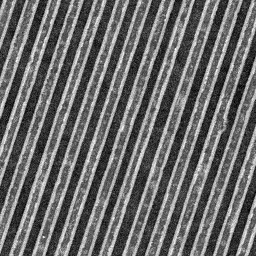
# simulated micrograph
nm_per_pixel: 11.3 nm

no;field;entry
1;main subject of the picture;parallel lines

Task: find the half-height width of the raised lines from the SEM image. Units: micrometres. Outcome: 0.112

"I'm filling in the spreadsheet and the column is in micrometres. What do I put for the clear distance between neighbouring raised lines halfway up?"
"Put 0.132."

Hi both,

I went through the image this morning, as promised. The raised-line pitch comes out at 0.243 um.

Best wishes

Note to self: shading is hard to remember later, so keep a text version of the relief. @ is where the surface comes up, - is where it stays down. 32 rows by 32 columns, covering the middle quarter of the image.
--@@@---@@----@@---@@@---@@----@
--@@----@@---@@@---@@---@@----@@
--@@---@@@---@@----@@---@@----@@
-@@@---@@----@@---@@@---@@----@@
-@@----@@---@@@---@@@--@@@---@@@
-@@---@@@---@@@---@@---@@----@@@
@@@---@@----@@---@@@---@@----@@-
@@----@@---@@@---@@@--@@----@@@-
@@---@@@---@@@---@@---@@----@@@-
@@---@@@---@@---@@@---@@----@@--
@@---@@---@@@---@@@--@@@---@@@--
@---@@@---@@@---@@---@@----@@@--
@---@@@---@@----@@---@@----@@---
@---@@---@@@---@@@--@@@---@@@---
---@@@---@@@---@@---@@----@@@---
---@@@---@@----@@---@@----@@---@
---@@---@@@---@@@--@@@---@@@---@
--@@@---@@@---@@---@@----@@@---@
--@@@---@@---@@@---@@----@@---@@
--@@---@@@---@@@--@@@---@@@---@@
-@@@---@@@---@@---@@----@@@---@@
-@@@---@@---@@@---@@----@@---@@@
-@@---@@@---@@@--@@@---@@@---@@@
@@@---@@@---@@---@@----@@@---@@-
@@@---@@----@@---@@----@@---@@@-
@@---@@@---@@@--@@@---@@@---@@@-
@@---@@@---@@---@@----@@----@@--
@@---@@---@@@---@@----@@---@@@--
@---@@@---@@@--@@@---@@@---@@@--
@---@@@---@@---@@----@@@---@@---
@---@@---@@@---@@----@@---@@@---
---@@@---@@@--@@@---@@@---@@@--@